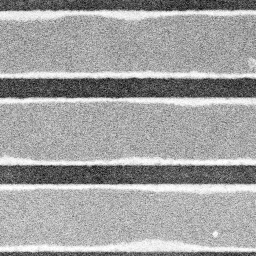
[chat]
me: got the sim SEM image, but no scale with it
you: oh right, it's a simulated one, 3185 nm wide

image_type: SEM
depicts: lines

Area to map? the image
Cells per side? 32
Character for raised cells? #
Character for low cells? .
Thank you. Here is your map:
................................
........###...........######.###
################################
################################
################################
################################
################################
################################
################################
#########.###.##.....#.##.######
................................
................................
.####################.......#.#.
################################
################################
################################
################################
################################
################################
################################
.....##.#.##....................
................................
................................
################################
################################
################################
################################
################################
################################
################################
################################
................................